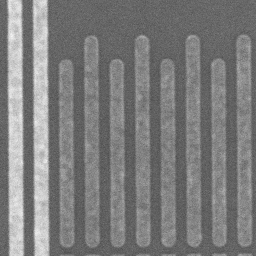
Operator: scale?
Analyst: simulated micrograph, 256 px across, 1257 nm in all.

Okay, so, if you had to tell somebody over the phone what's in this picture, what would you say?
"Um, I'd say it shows groups of lines, slits or small figures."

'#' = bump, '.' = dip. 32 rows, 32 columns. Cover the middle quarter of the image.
##...###....###...###...###....#
##...###....###...###...###....#
##...###....###...###...###....#
##...###....###...###...###....#
##...###....###...###...###....#
##...###....###...###...###....#
##...###....###...###...###....#
##...###....###...###...###....#
##...###....#.#...###...###....#
##...###....#.#...###....##....#
##...###....###...###....##....#
##...###....###...###....##....#
##...###....###...###....###...#
##...###....###...###....###...#
##...###....###...###....###...#
##...###....###...#.#....###...#
##...###....###...#.#....###...#
##...###....###...###....###...#
##...###....###...###....###...#
##...###....###...###....###...#
##...###....###...###....###...#
##...###....###...###....###...#
##...###....###...###....###...#
##...###....###...###....###...#
##...###....###...###....###...#
##...###....###...###....###...#
##...###....###...###....###...#
##...###....###...###....###...#
##...###....###...###....###...#
##...###....###...###....###...#
##...###....###...###....###...#
##...###....###...###....###....